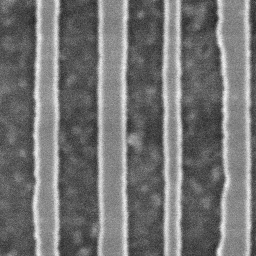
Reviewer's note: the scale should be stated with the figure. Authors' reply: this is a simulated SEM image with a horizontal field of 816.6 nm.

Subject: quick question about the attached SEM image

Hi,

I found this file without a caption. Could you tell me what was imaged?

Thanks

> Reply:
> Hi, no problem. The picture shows one or a few lines or trenches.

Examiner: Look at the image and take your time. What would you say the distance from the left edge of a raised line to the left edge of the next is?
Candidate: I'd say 201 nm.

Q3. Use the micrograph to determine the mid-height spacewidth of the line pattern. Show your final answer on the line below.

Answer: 0.134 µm